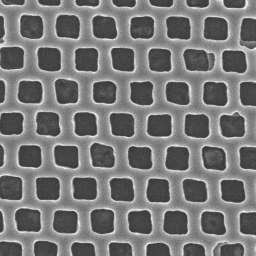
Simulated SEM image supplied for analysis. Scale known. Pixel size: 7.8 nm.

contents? a regular array of holes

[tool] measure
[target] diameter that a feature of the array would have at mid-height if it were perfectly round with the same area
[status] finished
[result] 201 nanometers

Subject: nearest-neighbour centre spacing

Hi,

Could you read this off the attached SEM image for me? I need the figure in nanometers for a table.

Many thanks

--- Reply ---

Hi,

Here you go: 284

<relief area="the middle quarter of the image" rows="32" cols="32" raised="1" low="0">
11100000011100000011100000011100
11100000111110000111110000011110
11111111111111111111111111111111
11111111111111111111111111111111
00011111000011111000011111000011
00001110000001110000001110000001
00001110000001111000001110000001
00001110000001110000001110000001
00001110000001110000001111000000
00011111000001111000001111100001
11111111111111111111011111111111
11111111111111111111111111111111
11100001111100000111111111111110
11000000111000000011100000011100
11100000111100000011100000011100
11100000111100000011100000011100
11100000111100000011100000011100
11100000111100000011100000011100
11111111111111111111111111111111
11111111111111111111111111111111
00011110000111111111111111111111
00001100000011110000001111000001
00001110000011110000001110000001
00001110000001110000001110000001
00001110000001110000001110000001
00001110000011111000001110000001
11111111111111111111111111000011
11111111111111111111111111111111
11000001111110001111110111111111
11000000111000000111100000111100
11000000111100000111100000111000
11000000111100000111100000111100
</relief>